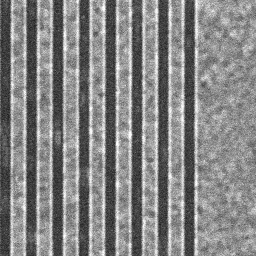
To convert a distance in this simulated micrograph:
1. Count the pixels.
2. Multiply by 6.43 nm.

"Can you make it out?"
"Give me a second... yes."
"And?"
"parallel lines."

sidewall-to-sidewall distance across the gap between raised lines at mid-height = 82.8 nm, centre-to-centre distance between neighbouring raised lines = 169 nanometres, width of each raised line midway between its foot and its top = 88.8 nanometres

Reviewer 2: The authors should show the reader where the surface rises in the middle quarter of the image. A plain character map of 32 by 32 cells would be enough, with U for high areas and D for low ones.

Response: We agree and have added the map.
UUUDDDDUUUDDDUUUDDDDUUUDDDDUUUDD
UUUDDDDUUUDDDUUUDDDDUUUDDDDUUUDD
UUUDDDDUUUDDDUUUDDDDUUUDDDDUUUDD
UUUDDDDUUUDDDUUUDDDDUUUDDDDUUUDD
UUUDDDDUUUDDDUUUDDDDUUUDDDDUUUDD
UUUDDDDUUUDDDUUUDDDDUUUDDDDUUUDD
UUUDDDDUUUDDDUUUDDDDUUUDDDDUUUDD
UUUDDDDUUUDDDUUUDDDDUUUDDDDUUUDD
UUUDDDDUUUDDDUUUDDDDUUUDDDDUUUDD
UUUDDDDUUUDDDUUUDDDDUUUDDDDUUUDD
UUUDDDDUUUDDDUUUDDDDUUUDDDDUUUDD
UUUDDDDUUUDDDUUUDDDDUUUDDDDUUUDD
UUUDDDDUUUDDDUUUDDDDUUUDDDDUUUDD
UUUDDDDUUUDDDUUUDDDDUUUDDDDUUUDD
UUUDDDDUUUDDDUUUDDDDUUUDDDDUUUDD
UUUDDDDUUUDDDUUUDDDDUUUDDDDUUUDD
UUUDDDDUUUDDDUUUDDDDUUUDDDDUUUDD
UUUDDDDUUUDDDUUUDDDDUUUDDDDUUUDD
UUUDDDDUUUDDDUUUDDDDUUUDDDDUUUDD
UUUDDDDUUUDDDUUUDDDDUUUDDDDUUUDD
UUUDDDDUUUDDDUUUDDDDUUUDDDDUUUDD
UUUDDDDUUUDDDUUUDDDDUUUDDDDUUUDD
UUUDDDDUUUDDDUUUDDDDUUUDDDDUUUDD
UUUDDDDUUUDDDUUUDDDDUUUDDDDUUUDD
UUUDDDDUUUDDDUUUDDDDUUUDDDDUUUDD
UUUDDDDUUUDDDUUUDDDDUUUDDDDUUUDD
UUUDDDDUUUDDDUUUDDDDUUUDDDDUUUDD
UUUDDDDUUUDDDUUUDDDDUUUDDDDUUUDD
UUUDDDDUUUDDDUUUDDDDUUUDDDDUUUDD
UUUDDDDUUUDDDUUUDDDDUUUDDDDUUUDD
UUUDDDDUUUDDDUUUDDDDUUUDDDDUUUDD
UUUDDDDUUUDDDUUUDDDDUUUDDDDUUUDD